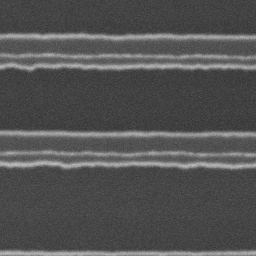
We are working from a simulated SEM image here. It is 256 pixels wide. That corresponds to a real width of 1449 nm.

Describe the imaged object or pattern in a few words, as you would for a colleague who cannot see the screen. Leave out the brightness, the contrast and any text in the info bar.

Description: lines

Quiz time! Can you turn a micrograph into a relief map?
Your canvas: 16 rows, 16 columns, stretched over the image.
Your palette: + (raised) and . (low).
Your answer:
................
................
++++++++++++++++
++++++++++++++++
................
................
................
................
++++++++++++++++
++++++++++++++++
................
................
................
................
................
................